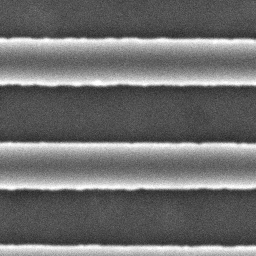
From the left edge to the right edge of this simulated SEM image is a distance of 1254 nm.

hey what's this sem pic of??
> lines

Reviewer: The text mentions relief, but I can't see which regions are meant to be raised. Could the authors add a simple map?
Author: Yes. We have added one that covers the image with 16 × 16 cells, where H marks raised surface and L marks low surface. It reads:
LLLLLLLLLLLLLLLL
LLLLLLLLLLLLLLLL
HHHHHHHHHHHHHHHH
HHHHHHHHHHHHHHHH
HHHHHHHHHHHHHHHH
LLLLLLLLLLLLLLLL
LLLLLLLLLLLLLLLL
LLLLLLLLLLLLLLLL
LLLLLLLLLLLLLLLL
HHHHHHHHHHHHHHHH
HHHHHHHHHHHHHHHH
HHHHHHHHHHHHHHHH
LLLLLLLLLLLLLLLL
LLLLLLLLLLLLLLLL
LLLLLLLLLLLLLLLL
HHHHHHHHHHHHHHHH